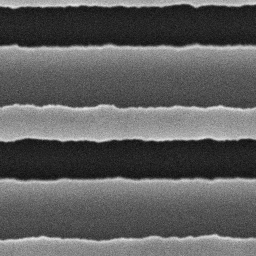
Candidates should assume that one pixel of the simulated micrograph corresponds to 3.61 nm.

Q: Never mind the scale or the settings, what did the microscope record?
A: lines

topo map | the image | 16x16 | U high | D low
DDDDDDDDDDDDDDDD
DDDDDDDDDDDDDDDD
DDDDDDDDDDDDDDDD
UUUUUUUUUUUUUUUU
UUUUUUUUUUUUUUUU
UUUUUUUUUUUUUUUU
UUUUUUUUUUUUUUUU
UUUUUUUUUUUUUUUU
UUUUUUUUUUUUUUUU
DDDDDDDDDDDDDDDD
DDDDDDDDDDDDDDDD
UUUUUUUUUUUUUUUU
UUUUUUUUUUUUUUUU
UUUUUUUUUUUUUUUU
UUUUUUUUUUUUUUUU
UUUUUUUUUUUUUUUU